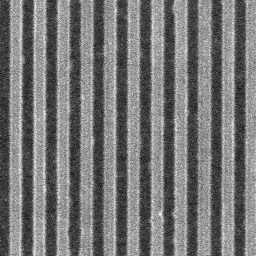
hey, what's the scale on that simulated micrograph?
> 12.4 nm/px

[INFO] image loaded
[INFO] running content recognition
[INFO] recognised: parallel lines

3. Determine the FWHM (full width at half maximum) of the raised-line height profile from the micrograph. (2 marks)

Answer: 0.182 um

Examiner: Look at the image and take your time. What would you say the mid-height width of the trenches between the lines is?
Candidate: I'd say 0.108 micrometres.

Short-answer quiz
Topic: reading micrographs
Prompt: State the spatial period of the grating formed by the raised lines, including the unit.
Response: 292 nanometers